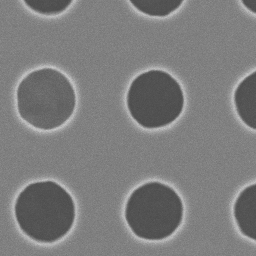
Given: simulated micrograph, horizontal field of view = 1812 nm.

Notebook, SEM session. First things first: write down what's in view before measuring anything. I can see holes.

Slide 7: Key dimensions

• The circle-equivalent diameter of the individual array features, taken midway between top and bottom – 0.415 um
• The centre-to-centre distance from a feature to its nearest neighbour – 773 nm